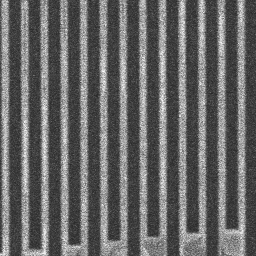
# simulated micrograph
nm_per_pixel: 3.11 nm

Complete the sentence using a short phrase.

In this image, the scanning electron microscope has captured parallel lines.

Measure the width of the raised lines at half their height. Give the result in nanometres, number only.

21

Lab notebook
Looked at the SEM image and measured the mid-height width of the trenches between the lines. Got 38.9 nm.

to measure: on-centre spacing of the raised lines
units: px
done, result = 19.7